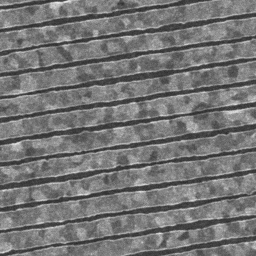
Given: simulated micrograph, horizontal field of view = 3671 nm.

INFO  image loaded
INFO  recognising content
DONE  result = parallel lines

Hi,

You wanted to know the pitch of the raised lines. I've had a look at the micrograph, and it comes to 22.1 px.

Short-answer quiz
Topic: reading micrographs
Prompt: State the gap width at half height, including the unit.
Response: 0.0744 µm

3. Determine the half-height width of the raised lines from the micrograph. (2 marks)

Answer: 241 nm